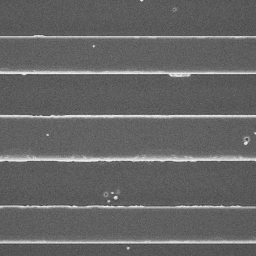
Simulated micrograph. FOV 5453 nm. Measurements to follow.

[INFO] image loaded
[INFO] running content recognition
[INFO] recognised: lines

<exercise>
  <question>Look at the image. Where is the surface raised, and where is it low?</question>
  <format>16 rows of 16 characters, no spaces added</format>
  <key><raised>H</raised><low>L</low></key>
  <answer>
LLLLLLLLLLLLLLLL
LLLLLLLLLLLLLLLL
HHHHHHHHHHHHHHHH
HHHHHHHHHHHHHHHH
HHHHHHHHHHHHHHHH
LLLLLLLLLLLLLLLL
LLLLLLLLLLLLLLLL
HHHHHHHHHHHHHHHH
HHHHHHHHHHHHHHHH
HHHHHHHHHHHHHHHH
LLLLLLLLLLLLLLLL
LLLLLLLLLLLLLLLL
LLLLLLLLLLLLLLLL
HHHHHHHHHHHHHHHH
HHHHHHHHHHHHHHHH
LLLLLLLLLLLLLLLL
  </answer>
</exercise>